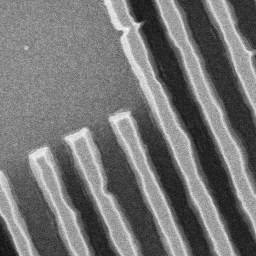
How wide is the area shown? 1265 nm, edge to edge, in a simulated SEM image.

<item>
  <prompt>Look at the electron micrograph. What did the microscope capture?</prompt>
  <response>parallel lines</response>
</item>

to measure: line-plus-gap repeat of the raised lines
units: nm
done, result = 220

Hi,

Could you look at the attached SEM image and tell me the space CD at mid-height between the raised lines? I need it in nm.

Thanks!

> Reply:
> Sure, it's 126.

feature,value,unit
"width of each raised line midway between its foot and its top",18.3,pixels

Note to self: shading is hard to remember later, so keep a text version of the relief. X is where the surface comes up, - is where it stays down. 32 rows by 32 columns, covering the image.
-------------XXX---XXX----XXX---
--------------XX----XXX---XXX---
--------------XXX---XXX----XX---
---------------XX----XX----XX---
---------------XXX---XXX----XX--
----------------XX----XX----XXX-
----------------XXX---XXX----XXX
----------------XXX----XX----XXX
-----------------XX----XX----XXX
------------------XX---XXX----XX
------------------XX----XX----XX
------------------XXX---XXX---XX
-------------------XX---XXX----X
-------------------XXX---XXX---X
---------------X----XX---XXX----
--------------XXX---XXX---XX----
----------X----XX---XXX---XXX---
---------XX----XXX---XXX---XXX--
---------XXX----XX---XXX---XXX--
----XX---XXX----XX----XX----XXX-
----XXX---XX-----XX---XXX---XXX-
-----XX---XXX----XX----XX----XX-
-----XXX---XX-----XX---XX----XX-
X-----XX---XX-----XX---XXX---XXX
X-----XX----XX----XXX---XX----XX
XX----XXX---XX-----XX---XXX---XX
XX-----XX---XXX----XX----XX---XX
XX-----XXX---XXX---XXX---XXX---X
-XX-----XX---XXX----XX----XX----
-XX-----XX----XXX---XXX---XXX---
--XX----XXX---XXX----XX---XXX---
--XX-----XX----XX----XXX---XX---